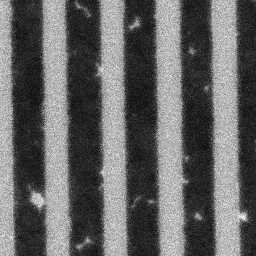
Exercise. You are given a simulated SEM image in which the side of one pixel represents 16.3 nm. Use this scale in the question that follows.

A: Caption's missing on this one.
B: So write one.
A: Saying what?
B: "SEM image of parallel lines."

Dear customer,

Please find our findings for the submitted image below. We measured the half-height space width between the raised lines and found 0.344 µm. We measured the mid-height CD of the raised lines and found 558 nanometres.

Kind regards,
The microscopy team